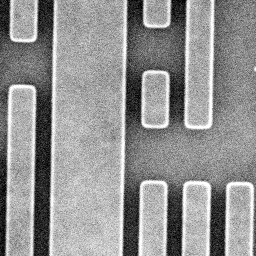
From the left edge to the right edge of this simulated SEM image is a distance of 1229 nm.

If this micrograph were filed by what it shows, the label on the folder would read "groups of lines, slits or small figures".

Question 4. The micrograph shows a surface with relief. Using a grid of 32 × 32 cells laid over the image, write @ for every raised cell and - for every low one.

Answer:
-@@@@--@@@@@@@@@--@@@--@@@@-----
-@@@@--@@@@@@@@@--@@@--@@@@-----
-@@@@--@@@@@@@@@--@@@--@@@@-----
-@@@---@@@@@@@@@-------@@@@-----
-@@@---@@@@@@@@@-------@@@@-----
-------@@@@@@@@@-------@@@@-----
-------@@@@@@@@@-------@@@@-----
-------@@@@@@@@@-------@@@@-----
-------@@@@@@@@@-------@@@@-----
-------@@@@@@@@@--@@@--@@@------
-------@@@@@@@@@--@@@--@@@------
-@@@---@@@@@@@@@--@@@--@@@------
-@@@---@@@@@@@@@--@@@--@@@------
-@@@---@@@@@@@@@--@@@--@@@------
-@@@---@@@@@@@@@--@@@--@@@------
-@@@---@@@@@@@@---@@@--@@@------
-@@@---@@@@@@@@-----------------
-@@@---@@@@@@@@-----------------
-@@@---@@@@@@@@-----------------
-@@@---@@@@@@@@-----------------
-@@@---@@@@@@@@-----------------
-@@@---@@@@@@@@-----------------
-@@@--@@@@@@@@@-----------------
-@@@--@@@@@@@@@---@@@--@@@--@@@@
-@@@--@@@@@@@@@---@@@--@@@--@@@@
-@@@--@@@@@@@@@---@@@--@@@--@@@@
-@@@--@@@@@@@@@---@@@--@@@--@@@@
-@@@--@@@@@@@@@--@@@@--@@@--@@@@
-@@@--@@@@@@@@@--@@@@--@@@--@@@@
-@@@--@@@@@@@@@--@@@@--@@@--@@@-
-@@@--@@@@@@@@@--@@@@--@@@--@@@-
-@@@--@@@@@@@@@--@@@@--@@@--@@@-